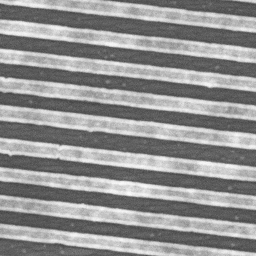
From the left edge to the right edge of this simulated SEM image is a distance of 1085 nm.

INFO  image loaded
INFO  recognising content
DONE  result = parallel lines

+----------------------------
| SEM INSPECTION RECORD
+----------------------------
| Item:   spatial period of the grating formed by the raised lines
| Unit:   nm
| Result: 124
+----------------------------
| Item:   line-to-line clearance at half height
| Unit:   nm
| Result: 75.3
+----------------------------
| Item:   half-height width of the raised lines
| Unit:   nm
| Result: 48.9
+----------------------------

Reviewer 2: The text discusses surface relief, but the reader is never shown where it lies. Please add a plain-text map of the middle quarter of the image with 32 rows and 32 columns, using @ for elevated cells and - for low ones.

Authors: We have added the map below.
@@@@@@@@@@@@@@@@@@--------------
-----@@@@@@@@@@@@@@@@@@@@@@-----
--------------@@@@@@@@@@@@@@@@@@
-----------------------@@@@@@@@@
-------------------------------@
--------------------------------
@@@@@@@@------------------------
@@@@@@@@@@@@@@@@@---------------
----@@@@@@@@@@@@@@@@@@@@@@------
------------@@@@@@@@@@@@@@@@@@@@
-------------------@@@@@@@@@@@@@
------------------------------@@
--------------------------------
@@@@@@@-------------------------
@@@@@@@@@@@@@@@@----------------
@@@@@@@@@@@@@@@@@@@@@@@@@@------
-----------@@@@@@@@@@@@@@@@@@@@@
------------------@@@@@@@@@@@@@@
--------------------------@@@@@@
--------------------------------
--------------------------------
@@@@@@--------------------------
@@@@@@@@@@@@@@@-----------------
@@@@@@@@@@@@@@@@@@@@@@@@--------
---------@@@@@@@@@@@@@@@@@@@@@@@
-----------------@@@@@@@@@@@@@@@
--------------------------@@@@@@
--------------------------------
@@@-----------------------------
@@@@@@@@@@@@--------------------
@@@@@@@@@@@@@@@@@@@@------------
---------@@@@@@@@@@@@@@@@@@@@---